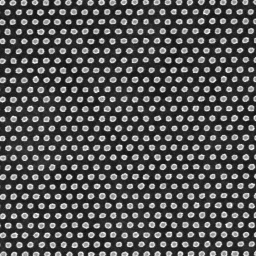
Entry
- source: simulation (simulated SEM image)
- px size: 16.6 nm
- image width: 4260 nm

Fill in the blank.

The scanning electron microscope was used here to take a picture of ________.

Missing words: a regular array of raised bodies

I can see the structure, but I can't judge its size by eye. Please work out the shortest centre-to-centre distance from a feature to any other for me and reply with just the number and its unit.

178 nm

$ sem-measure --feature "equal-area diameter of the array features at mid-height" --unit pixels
5.64